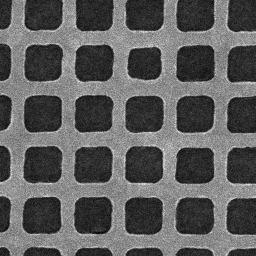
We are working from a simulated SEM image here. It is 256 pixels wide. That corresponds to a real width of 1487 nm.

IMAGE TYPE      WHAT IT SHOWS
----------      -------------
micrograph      a regular array of holes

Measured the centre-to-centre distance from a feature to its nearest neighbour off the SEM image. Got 293 nm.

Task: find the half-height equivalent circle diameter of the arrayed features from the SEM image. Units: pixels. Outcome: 41.4